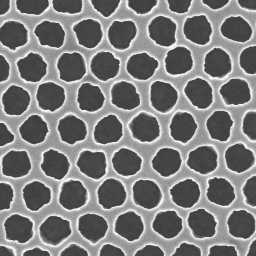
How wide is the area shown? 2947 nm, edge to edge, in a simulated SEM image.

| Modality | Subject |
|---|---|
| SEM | a regular array of holes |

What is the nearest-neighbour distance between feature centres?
0.405 micrometres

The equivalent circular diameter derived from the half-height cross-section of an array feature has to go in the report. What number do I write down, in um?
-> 0.327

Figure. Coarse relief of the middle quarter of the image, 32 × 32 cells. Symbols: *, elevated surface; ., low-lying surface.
.....*........**.......**.......
.....**.......**.......***.....*
.....**......***......*****..***
....****....******...***********
***************.*******..******.
****...*****.....*****.....****.
****.....***......****......**..
***.......**.......***......**..
***.......**.......***......***.
***.......**.......***......****
****......***......***.....*****
****....***************...******
*******************.********...*
....******...*****.....****.....
.....****.....***......****.....
.....***......**........**......
......**.......**.......***.....
......*........**.......***.....
.....**.......****.....****.....
...*****.....******.************
********************************
**************...*******....****
****......***.....*****......**.
.***......**.......***.......**.
.**.......**.......***.......**.
.**.......**.......***.......**.
.***......***......****......***
.****.....****....******...*****
*******..**.********************
....******....****....*******...
.....****......**......****.....
......***......**.......***.....